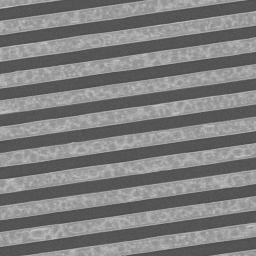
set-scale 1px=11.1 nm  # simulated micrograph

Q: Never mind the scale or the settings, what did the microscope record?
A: parallel lines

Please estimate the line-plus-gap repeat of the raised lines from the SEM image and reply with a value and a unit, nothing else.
0.289 um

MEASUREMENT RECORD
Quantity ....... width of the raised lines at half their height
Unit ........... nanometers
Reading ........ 152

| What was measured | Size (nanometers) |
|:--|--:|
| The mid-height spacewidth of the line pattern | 133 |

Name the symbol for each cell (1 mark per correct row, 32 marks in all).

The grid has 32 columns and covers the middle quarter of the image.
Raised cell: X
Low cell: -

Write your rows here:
XXXXXXXXXXXXXXXXXXXXXXX---------
XXXXXXXXXXXXXXXX----------------
XXXXXXXXX----------------------X
XX----------------------XXXXXXXX
-----------------XXXXXXXXXXXXXXX
----------XXXXXXXXXXXXXXXXXXXXXX
---XXXXXXXXXXXXXXXXXXXXXXX------
XXXXXXXXXXXXXXXXXXX-------------
XXXXXXXXXXXX--------------------
XXXXX-----------------------XXXX
---------------------XXXXXXXXXXX
--------------XXXXXXXXXXXXX-XXXX
-------XXXXXXXXXXXXXXXXXXXXXXXX-
XXXXXXXXXXXXXXXXXXXXXXX---------
XXXXXXXXXXXXXXXX----------------
XXXXXXXXXX----------------------
XX------------------------XXXXXX
-------------------XXXXXXXXXXXXX
-----------XXXXXXXXXXXXXXXXXXXXX
-----XXXXXXXXXXXXXXXXXXXXXXX----
XXXXXXXXXXXXXXXXXXXXX-----------
XXXXXXXXXXXXXX------------------
XXXXXXX----------------------XXX
----------------------XXXXXXXXXX
---------------XXXXXXXXXXXXXXXXX
--------XXXXXXXXXXXXXXXXXXXXXXXX
-XXXXXXXXXXXXXXXXXXXXXXXXX------
XXXXXXXXXXXXXXXXXXX-------------
XXXXXXXXXXX---------------------
XXXX-----------------------XXXXX
--------------------XXXXXXXXXXXX
-------------XXXXXXXXXXXXXXXXXXX